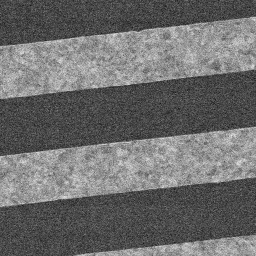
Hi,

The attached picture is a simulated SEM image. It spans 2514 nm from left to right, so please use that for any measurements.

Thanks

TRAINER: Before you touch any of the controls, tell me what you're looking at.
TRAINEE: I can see one or a few lines or trenches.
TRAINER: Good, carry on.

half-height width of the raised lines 491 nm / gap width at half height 563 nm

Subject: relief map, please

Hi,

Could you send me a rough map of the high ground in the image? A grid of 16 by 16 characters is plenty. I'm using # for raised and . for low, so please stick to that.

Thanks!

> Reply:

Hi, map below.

................
............####
....############
################
###############.
######..........
................
................
...........#####
...#############
################
############....
###.............
................
................
.........#######